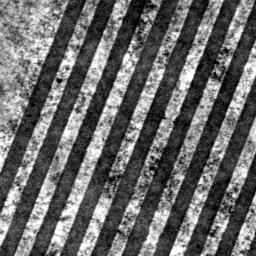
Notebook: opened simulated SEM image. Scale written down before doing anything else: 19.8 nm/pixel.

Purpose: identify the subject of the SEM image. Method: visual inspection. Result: parallel lines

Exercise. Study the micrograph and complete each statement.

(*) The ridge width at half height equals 12.5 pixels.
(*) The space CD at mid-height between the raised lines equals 16.7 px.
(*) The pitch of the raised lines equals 0.57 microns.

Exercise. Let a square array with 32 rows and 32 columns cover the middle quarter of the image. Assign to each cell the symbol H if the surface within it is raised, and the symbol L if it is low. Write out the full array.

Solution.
HHLLLLLHHHLLLLHHHHLLLLHHHLLLLLHH
HHLLLLHHHHLLLLHHHLLLLLHHHLLLLLHH
HLLLLLHHHLLLLLHHHLLLLLHHHLLLLHHH
HLLLLLHHHLLLLHHHHLLLLHHHLLLLLHHH
LLLLLHHHLLLLLHHHLLLLLHHHLLLLHHHL
LLLLLHHHLLLLHHHHLLLLHHHLLLLLHHHL
LLLLHHHHLLLLHHHLLLLLHHHLLLLLHHHL
LLLLHHHLLLLLHHHLLLLLHHHLLLLHHHLL
LLLLHHHLLLLHHHHLLLLHHHLLLLLHHHLL
LLLHHHHLLLLHHHLLLLLHHHLLLLHHHHLL
LLLHHHLLLLHHHHLLLLHHHLLLLLHHHLLL
LLHHHHLLLLHHHLLLLLHHHLLLLLHHHLLL
LLHHHLLLLLHHHLLLLLHHHLLLLHHHHLLL
LLHHHLLLLHHHHLLLLHHHLLLLLHHHLLLL
LHHHLLLLLHHHLLLLLHHHLLLLHHHLLLLL
LHHHLLLLHHHHLLLLHHHLLLLLHHHLLLLL
HHHLLLLLHHHLLLLLHHHLLLLLHHHLLLLH
HHHLLLLLHHHLLLLLHHHLLLLHHHLLLLLH
HHHLLLLHHHHLLLLHHHLLLLLHHHLLLLHH
HHLLLLLHHHLLLLLHHHLLLLHHHHLLLLHH
HHLLLLHHHHLLLLHHHLLLLLHHHLLLLLHH
HHLLLLHHHLLLLLHHHLLLLLHHHLLLLHHH
HLLLLLHHHLLLLLHHHLLLLHHHHLLLLHHH
HLLLLHHHHLLLLHHHLLLLLHHHLLLLHHHH
LLLLLHHHLLLLLHHHLLLLHHHLLLLLHHHL
LLLLHHHHLLLLHHHLLLLLHHHLLLLLHHHL
LLLLHHHLLLLLHHHLLLLLHHHLLLLHHHHL
LLLLHHHLLLLLHHHLLLLHHHLLLLLHHHLL
LLLHHHHLLLLHHHLLLLLHHHLLLLHHHHLL
LLLHHHLLLLLHHHLLLLHHHLLLLLHHHLLL
LLHHHHLLLLHHHLLLLLHHHLLLLLHHHLLL
LLHHHLLLLLHHHLLLLLHHHLLLLHHHHLLL